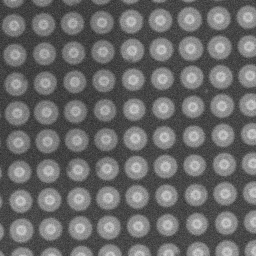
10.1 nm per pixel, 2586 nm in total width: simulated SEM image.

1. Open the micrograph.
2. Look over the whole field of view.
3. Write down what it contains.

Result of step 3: an array of small figures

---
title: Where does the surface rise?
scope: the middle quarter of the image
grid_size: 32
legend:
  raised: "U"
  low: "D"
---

DDDDDDDDDDDDDDDDDDDDDDDDDDDDDDDD
DDDDDDDDDDUDDDDDUUUDDDDUUUDDDDUU
DUUUUDDDUUUUDDDUUUUUDDUUUUUDDUUU
UUUUUDDUUUUUUDDUUUUUDDUUUUUDDUUU
UUUUUDDUUUUUUDDUUUUUDDUUUUUDDUUU
UUUUUDDDUUUUUDDUUUUUDDUUUUUDDDUU
DUUUUDDDUUUUDDDDDUDDDDDDDDDDDDDD
DDDDDDDDDDDDDDDDDDDDDDDDDDDDDDDD
DDDDDDDDDDDDDDDDDDDDDDDDUUDDDDDU
DDUUDDDDUUUUDDDDUUUUDDDUUUUDDDUU
UUUUUDDDUUUUUDDUUUUUDDUUUUUUDDUU
UUUUUUDDUUUUUDDUUUUUDDUUUUUUDDUU
UUUUUUDDUUUUUDDUUUUUDDUUUUUDDDUU
UUUUUDDDUUUUDDDDUUUDDDDDUUDDDDDD
DDUUDDDDDDDDDDDDDDDDDDDDDDDDDDDD
DDDDDDDDDDDDDDDDDDDDDDDDDDDDDDDD
DDUUDDDDDUUUDDDDUUUUDDDUUUUDDDUU
DUUUUDDDUUUUUDDUUUUUDDUUUUUUDDUU
UUUUUUDDUUUUUDDUUUUUUDUUUUUUDDUU
UUUUUUDDUUUUUDDUUUUUUDDUUUUUDDUU
DUUUUUDDUUUUUDDDUUUUDDDUUUUDDDDU
DDUUUDDDDUUUDDDDDUDDDDDDDDDDDDDD
DDDDDDDDDDDDDDDDDDDDDDDDDDDDDDDD
DDDDDDDDDDUUDDDDDUUUDDDUUUUDDDDU
DDUUUDDDUUUUUDDDUUUUUDDUUUUUDDUU
DUUUUUDDUUUUUDDUUUUUUDDUUUUUDDUU
DUUUUUDDUUUUUUDUUUUUUDDUUUUUDDUU
DUUUUUDDUUUUUDDDUUUUDDDUUUUDDDDU
DDUUUDDDDUUUUDDDDUUDDDDDDDDDDDDD
DDDDDDDDDDDDDDDDDDDDDDDDDDDDDDDD
DDDDDDDDDDDDDDDDDUUDDDDDUUUDDDDU
DDUUUDDDDUUUUDDDUUUUUDDUUUUUDDDU